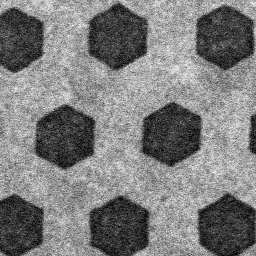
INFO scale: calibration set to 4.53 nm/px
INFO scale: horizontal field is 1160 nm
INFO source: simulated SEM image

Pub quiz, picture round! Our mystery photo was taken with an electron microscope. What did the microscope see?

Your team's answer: holes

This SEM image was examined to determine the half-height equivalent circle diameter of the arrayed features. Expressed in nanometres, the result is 284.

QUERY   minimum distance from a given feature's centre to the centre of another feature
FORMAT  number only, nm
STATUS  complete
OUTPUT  484